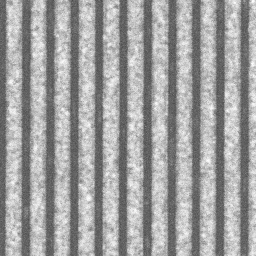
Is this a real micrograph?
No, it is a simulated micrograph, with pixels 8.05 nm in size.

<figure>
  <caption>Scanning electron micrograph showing parallel lines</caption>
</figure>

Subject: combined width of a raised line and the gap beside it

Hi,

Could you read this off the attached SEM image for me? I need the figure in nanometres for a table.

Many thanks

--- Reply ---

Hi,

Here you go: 196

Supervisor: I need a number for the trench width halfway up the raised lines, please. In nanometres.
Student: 76.4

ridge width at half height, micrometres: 0.12